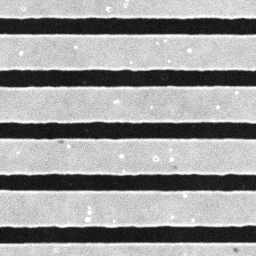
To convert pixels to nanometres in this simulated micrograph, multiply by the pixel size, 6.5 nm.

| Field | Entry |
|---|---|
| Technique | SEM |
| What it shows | lines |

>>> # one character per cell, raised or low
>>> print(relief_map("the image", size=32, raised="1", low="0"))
11111111111111111111111111111111
11111111111111111111111111111111
00000000000000000000000000000000
00000000000000000000000000000000
11111111111111111111111111111111
11111111111111111111111111111111
11111111111111111111111111111111
11111111111111111111111111111111
11111111111111111111111111111111
00000000000000000000000000000000
00000000000000000000000000000000
11111111111111111111111111111111
11111111111111111111111111111111
11111111111111111111111111111111
11111111111111111111111111111111
00000000000000000000000000000000
00000000000000000000000000000000
11111111111111111111111111111111
11111111111111111111111111111111
11111111111111111111111111111111
11111111111111111111111111111111
11111111111111111111111111111111
00000000000000000000000000000000
00000000000000000000000000000000
11111111111111111111111111111111
11111111111111111111111111111111
11111111111111111111111111111111
11111111111111111111111111111111
00000000000000000000000000000000
00000000000000000000000000000000
00011111111111111111111111111111
11111111111111111111111111111111